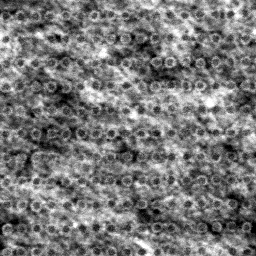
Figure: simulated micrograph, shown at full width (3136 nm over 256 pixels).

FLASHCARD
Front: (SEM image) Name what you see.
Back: a regular array of raised bodies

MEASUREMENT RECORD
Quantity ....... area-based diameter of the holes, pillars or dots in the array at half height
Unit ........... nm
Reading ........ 112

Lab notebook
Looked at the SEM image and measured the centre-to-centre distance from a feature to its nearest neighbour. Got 178 nm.